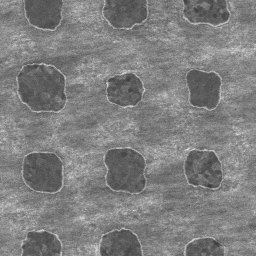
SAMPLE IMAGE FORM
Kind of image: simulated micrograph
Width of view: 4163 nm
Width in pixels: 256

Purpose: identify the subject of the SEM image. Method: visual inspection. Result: raised bodies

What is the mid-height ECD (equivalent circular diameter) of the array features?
679 nm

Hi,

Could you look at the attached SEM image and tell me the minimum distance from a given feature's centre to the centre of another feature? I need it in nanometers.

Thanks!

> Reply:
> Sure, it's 1280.